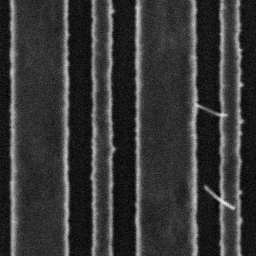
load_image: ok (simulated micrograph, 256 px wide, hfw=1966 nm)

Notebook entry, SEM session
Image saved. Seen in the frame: lines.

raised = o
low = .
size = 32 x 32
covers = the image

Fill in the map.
.ooooooo....oo...ooooooo....oo..
.ooooooo....oo...ooooooo....oo..
.ooooooo....oo...ooooooo....oo..
.ooooooo....oo...ooooooo....oo..
.ooooooo....oo...ooooooo....oo..
.ooooooo....oo...ooooooo....oo..
.ooooooo....oo...ooooooo....oo..
.ooooooo....oo...ooooooo....oo..
.ooooooo....oo...ooooooo....oo..
.ooooooo....oo...ooooooo....oo..
.oooooooo...oo...ooooooo....oo..
.ooooooo....oo...oooooooo...oo..
.ooooooo....oo...oooooooo...oo..
.ooooooo....oo...oooooooo...oo..
.ooooooo....oo...ooooooo....oo..
.ooooooo....oo...ooooooo....oo..
.oooooooo...oo...ooooooo....oo..
.ooooooo....oo...ooooooo....oo..
.ooooooo....oo...oooooooo...oo..
.ooooooo....oo...ooooooo....oo..
..oooooo....oo...ooooooo....oo..
..oooooo....oo...oooooooo...oo..
.ooooooo....oo...ooooooo....oo..
.ooooooo....oo...ooooooo....oo..
.oooooooo...oo...oooooooo...oo..
.ooooooo....oo...ooooooo....oo..
..ooooooo...oo...ooooooo....oo..
..oooooo....oo...ooooooo....oo..
..ooooooo...oo...oooooooo...oo..
..oooooo....oo...oooooooo...oo..
..oooooo....oo...oooooooo...oo..
..oooooo....oo...oooooooo...oo..